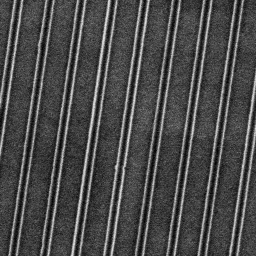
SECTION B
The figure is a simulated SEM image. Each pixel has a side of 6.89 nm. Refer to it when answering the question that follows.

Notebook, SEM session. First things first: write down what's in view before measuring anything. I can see parallel lines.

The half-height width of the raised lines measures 0.0571 micrometres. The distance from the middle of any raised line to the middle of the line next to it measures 0.215 microns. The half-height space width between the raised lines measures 160 nm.